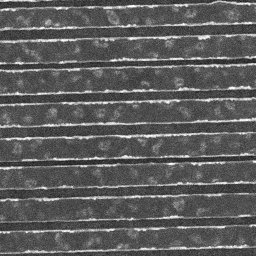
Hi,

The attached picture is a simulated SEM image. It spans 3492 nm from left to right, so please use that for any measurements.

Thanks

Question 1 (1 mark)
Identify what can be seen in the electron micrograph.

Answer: parallel lines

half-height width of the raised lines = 317 nanometres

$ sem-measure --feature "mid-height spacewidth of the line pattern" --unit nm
123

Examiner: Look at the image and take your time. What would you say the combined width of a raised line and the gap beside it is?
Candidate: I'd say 435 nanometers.